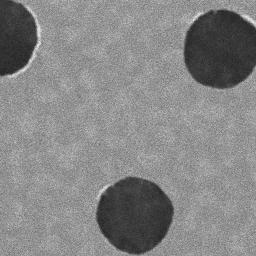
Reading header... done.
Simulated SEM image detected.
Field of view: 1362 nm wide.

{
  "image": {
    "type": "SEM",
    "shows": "holes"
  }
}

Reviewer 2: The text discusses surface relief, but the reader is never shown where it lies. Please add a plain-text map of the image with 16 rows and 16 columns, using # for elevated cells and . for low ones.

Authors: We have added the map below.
..##############
..##########....
..##########....
..##########....
.###########....
################
################
################
################
################
################
#######...######
######.....#####
######.....#####
######....######
#######...######